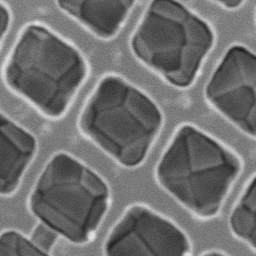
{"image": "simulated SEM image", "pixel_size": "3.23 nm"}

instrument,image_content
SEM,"holes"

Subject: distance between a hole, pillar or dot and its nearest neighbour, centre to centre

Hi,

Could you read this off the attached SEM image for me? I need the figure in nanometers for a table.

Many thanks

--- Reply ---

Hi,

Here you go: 296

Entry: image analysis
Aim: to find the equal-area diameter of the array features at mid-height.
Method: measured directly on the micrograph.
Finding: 254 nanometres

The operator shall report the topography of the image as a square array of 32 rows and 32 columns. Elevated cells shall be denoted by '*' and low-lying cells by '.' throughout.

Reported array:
*******..........**....*****..**
.********.......**......********
.*********.....***.......*******
.**...*****....**.........******
***....*****..***..........*****
**......********...........*****
**........*******.........**...*
*.........********.......***....
*..........********......**.....
*..........*********....***.....
*.........**....******..**......
**.......***......********......
****.....**........*******......
*****...***.........*******.....
.*****.***..........********....
..********..........*********...
...*******..........**...******.
....********.......***.....*****
....*********......**.......****
....***..*****....**.........***
....**....*****..***..........**
...**.......********..........**
..***........*******.........***
..**.........********........**.
****..........********......**..
****.........**********.....**..
****.........***...*****...**...
*****........**......********...
******......**........*******...
...*****...***.........*******..
....*********...........*******.
.....********..........*********